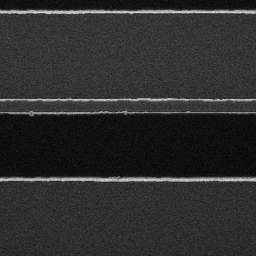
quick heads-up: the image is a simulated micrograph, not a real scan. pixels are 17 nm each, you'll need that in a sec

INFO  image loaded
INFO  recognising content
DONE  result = lines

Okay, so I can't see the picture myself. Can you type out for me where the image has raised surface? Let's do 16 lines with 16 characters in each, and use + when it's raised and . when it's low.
++++++++++++++++
................
................
................
................
................
................
++++++++++++++++
++++++++++++++++
++++++++++++++++
++++++++++++++++
................
................
................
................
................